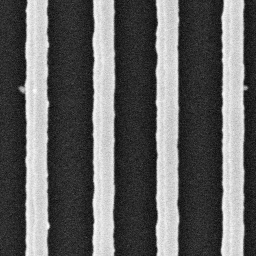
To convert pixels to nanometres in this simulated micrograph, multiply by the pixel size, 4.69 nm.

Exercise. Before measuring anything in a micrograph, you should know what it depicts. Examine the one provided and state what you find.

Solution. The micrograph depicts lines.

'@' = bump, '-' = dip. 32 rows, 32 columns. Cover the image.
----@@------@@------@@------@@--
---@@@------@@------@@------@@--
---@@@------@@------@@------@@--
---@@@------@@------@@------@@--
---@@@------@@------@@------@@--
---@@@------@@------@@------@@--
---@@@------@@------@@------@@--
---@@@------@@------@@------@@--
---@@@------@@------@@------@@--
---@@@------@@------@@------@@--
---@@@------@@------@@------@@--
---@@@------@@------@@------@@--
---@@@------@@------@@------@@--
---@@@------@@------@@------@@--
---@@@------@@------@@------@@--
---@@@------@@------@@------@@--
---@@@------@@------@@------@@--
---@@@------@@------@@------@@--
---@@@------@@------@@------@@--
---@@@------@@------@@------@@--
---@@@------@@------@@------@@--
---@@@------@@------@@------@@--
---@@@------@@------@@------@@--
---@@@------@@------@@------@@--
---@@@------@@------@@------@@--
---@@@------@@------@@------@@--
---@@@------@@------@@------@@--
---@@@------@@------@@------@@--
---@@@------@@------@@------@@--
---@@@------@@------@@------@@--
---@@@------@@------@@------@@--
---@@@------@@------@@------@@--